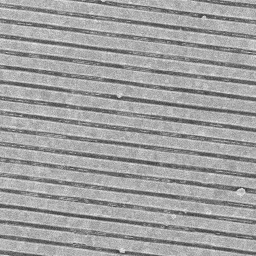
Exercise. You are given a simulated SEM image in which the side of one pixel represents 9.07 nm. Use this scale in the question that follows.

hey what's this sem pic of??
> parallel lines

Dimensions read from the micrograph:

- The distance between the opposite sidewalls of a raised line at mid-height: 94.4 nm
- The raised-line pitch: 0.139 micrometres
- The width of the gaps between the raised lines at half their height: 47.3 nm